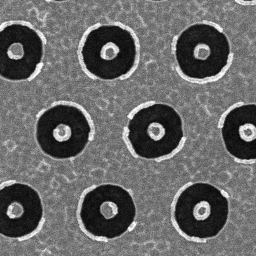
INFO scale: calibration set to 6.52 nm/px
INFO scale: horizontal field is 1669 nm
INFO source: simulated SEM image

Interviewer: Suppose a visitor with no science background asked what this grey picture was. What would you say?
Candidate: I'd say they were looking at ring-shaped grooves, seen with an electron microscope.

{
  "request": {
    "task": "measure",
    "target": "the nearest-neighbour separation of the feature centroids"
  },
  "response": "596 nanometers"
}